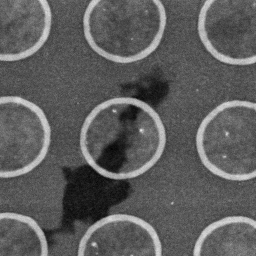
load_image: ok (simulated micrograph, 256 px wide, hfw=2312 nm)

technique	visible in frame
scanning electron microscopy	raised bodies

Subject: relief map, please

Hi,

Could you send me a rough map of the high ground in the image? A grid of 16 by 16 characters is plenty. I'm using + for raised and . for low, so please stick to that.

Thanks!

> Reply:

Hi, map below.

+++...++++...+++
+++..+++++...+++
+++...++++...+++
+......++.....++
................
................
++.....++.....+.
+++...++++...+++
+++..+++++...+++
+++..+++++...+++
++....+++....+++
................
................
+...............
++....+++....+++
+++..+++++..++++